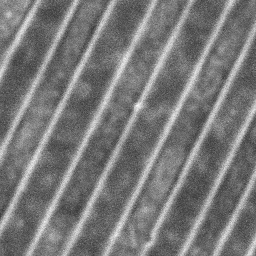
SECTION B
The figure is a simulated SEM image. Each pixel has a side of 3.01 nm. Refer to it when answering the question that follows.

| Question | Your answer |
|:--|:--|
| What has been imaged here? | one or a few lines or trenches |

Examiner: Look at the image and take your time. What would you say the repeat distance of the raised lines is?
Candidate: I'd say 208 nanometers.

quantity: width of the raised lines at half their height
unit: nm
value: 114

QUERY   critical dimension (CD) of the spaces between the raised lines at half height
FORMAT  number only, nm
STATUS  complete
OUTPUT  93.8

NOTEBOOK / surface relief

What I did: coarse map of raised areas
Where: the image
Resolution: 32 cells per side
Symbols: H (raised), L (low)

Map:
LLLLHHHHHHLLLLHHHHHLLLLLHHHHHLLL
LLLLHHHHHLLLLHHHHHHLLLLHHHHHLLLL
LLLHHHHHHLLLLHHHHHLLLLLHHHHHLLLL
LLLHHHHHLLLLHHHHHHLLLLHHHHHLLLLL
LLHHHHHHLLLLHHHHHLLLLLHHHHHLLLLH
LLHHHHHLLLLHHHHHHLLLLHHHHHLLLLLH
LHHHHHHLLLLHHHHHLLLLLHHHHHLLLLHH
LHHHHHLLLLHHHHHHLLLLHHHHHLLLLLHH
HHHHHHLLLLHHHHHLLLLLHHHHHLLLLHHH
HHHHHLLLLHHHHHHLLLLHHHHHLLLLLHHH
HHHHHLLLLHHHHHLLLLLHHHHHLLLLHHHH
HHHHLLLLHHHHHHLLLLHHHHHLLLLLHHHH
HHHHLLLLHHHHHLLLLLHHHHHLLLLHHHHH
HHHLLLLHHHHHHLLLLHHHHHLLLLLHHHHH
HHHLLLLHHHHHLLLLLHHHHHLLLLHHHHHL
HHLLLLHHHHHHLLLLHHHHHLLLLLHHHHHL
HHLLLLHHHHHLLLLLHHHHHLLLLHHHHHLL
HLLLLHHHHHHLLLLHHHHHLLLLLHHHHHLL
HLLLLHHHHHLLLLLHHHHHLLLLHHHHHLLL
LLLLHHHHHHLLLLHHHHHLLLLLHHHHHLLL
LLLLHHHHHLLLLLHHHHHLLLLHHHHHLLLL
LLLHHHHHHLLLLHHHHHLLLLLHHHHHLLLL
LLLHHHHHLLLLLHHHHHLLLLHHHHHHLLLL
LLLHHHHHLLLLHHHHHLLLLLHHHHHLLLLH
LLHHHHHLLLLLHHHHHLLLLHHHHHHLLLLH
LLHHHHHLLLLHHHHHLLLLLHHHHHLLLLHH
LHHHHHLLLLLHHHHHLLLLHHHHHHLLLLHH
LHHHHHLLLLHHHHHLLLLLHHHHHLLLLHHH
HHHHHLLLLLHHHHHLLLLHHHHHHLLLLHHH
HHHHHLLLLHHHHHLLLLLHHHHHLLLLHHHH
HHHHLLLLLHHHHHLLLLLHHHHHLLLLHHHH
HHHHLLLLHHHHHLLLLLHHHHHLLLLHHHHL